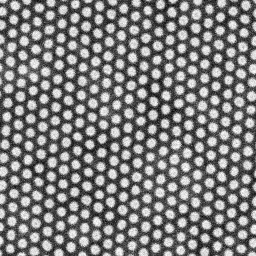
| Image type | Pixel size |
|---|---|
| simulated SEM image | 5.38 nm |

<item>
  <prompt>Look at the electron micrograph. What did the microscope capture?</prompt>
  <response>a regular array of raised bodies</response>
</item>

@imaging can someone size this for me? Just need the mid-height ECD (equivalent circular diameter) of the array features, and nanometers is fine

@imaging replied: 44.2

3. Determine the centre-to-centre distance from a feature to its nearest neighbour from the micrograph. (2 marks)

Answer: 72.4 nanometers